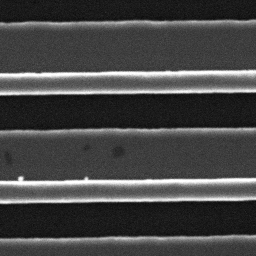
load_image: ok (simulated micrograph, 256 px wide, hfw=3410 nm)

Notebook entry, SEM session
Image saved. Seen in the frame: lines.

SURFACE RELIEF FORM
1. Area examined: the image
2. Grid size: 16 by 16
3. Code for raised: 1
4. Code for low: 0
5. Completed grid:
0000000000000000
0111111111111111
1111111111111111
1111111111111111
1111111111111111
1111111111111111
0000000000000000
0000000000000000
1111111111111111
1111111111111111
1111111111111111
1111111111111111
1111111111111111
0000000000000000
0000000000000000
1111111111111111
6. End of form